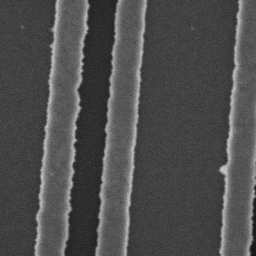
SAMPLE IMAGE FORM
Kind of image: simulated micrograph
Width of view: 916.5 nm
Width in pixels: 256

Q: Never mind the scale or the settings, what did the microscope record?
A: lines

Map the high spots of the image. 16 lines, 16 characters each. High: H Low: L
LLLHHLLHHLLLLLLH
LLLHHLLHHLLLLLLH
LLLHHLLHHLLLLLLH
LLLHHLLHHLLLLLLH
LLLHHLLHHLLLLLLH
LLLHHLLHHLLLLLLH
LLLHHLLHHLLLLLHH
LLLHHLLHHLLLLLHH
LLLHHLLHHLLLLLHH
LLLHHLLHLLLLLLHH
LLLHHLHHLLLLLLHH
LLLHLLHHLLLLLLHH
LLHHLLHHLLLLLLHH
LLHHLLHHLLLLLLHH
LLHHLLHHLLLLLLHH
LLHHLLHHLLLLLLHH